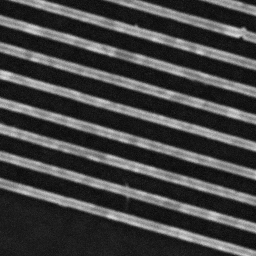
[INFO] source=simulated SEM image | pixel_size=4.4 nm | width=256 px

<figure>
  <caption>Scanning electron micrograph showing parallel lines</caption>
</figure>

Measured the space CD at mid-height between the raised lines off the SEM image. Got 0.0856 micrometres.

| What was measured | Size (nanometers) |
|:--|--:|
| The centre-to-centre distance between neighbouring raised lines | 115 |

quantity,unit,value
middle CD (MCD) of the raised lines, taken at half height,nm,29.6